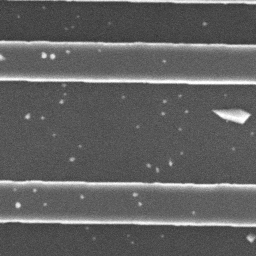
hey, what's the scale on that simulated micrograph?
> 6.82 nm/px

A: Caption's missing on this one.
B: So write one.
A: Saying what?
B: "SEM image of lines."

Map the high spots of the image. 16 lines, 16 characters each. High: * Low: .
................
................
................
****************
****************
................
................
................
................
................
................
*********.......
****************
****************
................
................